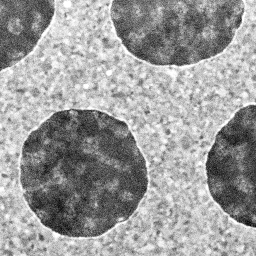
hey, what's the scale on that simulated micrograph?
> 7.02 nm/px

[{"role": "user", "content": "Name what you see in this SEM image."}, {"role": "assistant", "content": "holes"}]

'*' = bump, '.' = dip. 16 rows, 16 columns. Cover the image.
...****........*
...****........*
..*****........*
..******.....***
****************
****************
****************
***.....******..
**......*****...
*........****...
*........****...
*........****...
**.......****...
**......******..
***....*********
****************